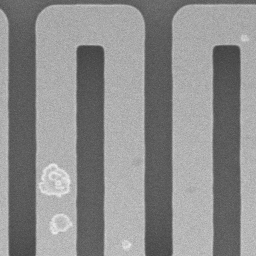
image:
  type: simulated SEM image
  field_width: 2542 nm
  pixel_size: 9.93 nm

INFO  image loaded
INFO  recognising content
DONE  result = groups of lines, slits or small figures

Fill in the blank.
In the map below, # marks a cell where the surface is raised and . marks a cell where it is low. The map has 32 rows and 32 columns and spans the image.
................................
.....############.....##########
#....#############....##########
#....#############....##########
#....#############....##########
#....#############....##########
#....#####...#####....#####...##
#....#####...#####....####....##
#....#####...#####....####....##
#....####....#####....#####...##
#....#####...#####....####....##
#....####....#####....####....##
#....#####...#####....####....##
#....#####...#####....####....##
#....####....#####....#####...##
#....####....#####....####....##
#....#####...#####....####....##
#....#####...#####....####....##
#....####....#####....####....##
#....#####...#####....####....##
#....#####...#####....####....##
#....#####...#####....####....##
#....#####...#####....#####...##
#....#####...#####....####....##
#....#####...#####....#####...##
#....####....#####....#####...##
#....#####...#####....#####...##
#....#####...#####....####....##
#....#####...#####....#####...##
#....#####...#####....#####...##
#....####....#####....#####...##
#....#####...#####....####....##